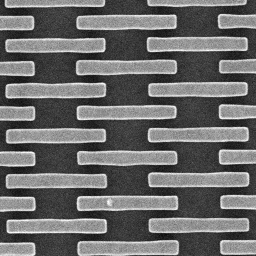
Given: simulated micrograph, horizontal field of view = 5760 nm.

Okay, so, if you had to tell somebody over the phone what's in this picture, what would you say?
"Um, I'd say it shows groups of lines, slits or small figures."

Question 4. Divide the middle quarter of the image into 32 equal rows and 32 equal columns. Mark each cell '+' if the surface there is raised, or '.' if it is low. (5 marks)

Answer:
...+++++++++++++++++++++++++....
...+++++++++++++++++++++++++....
...+++++++++++..................
................................
................................
++++++++++...........+++++++++++
++++++++++...........+++++++++++
++++++++++...........+++++++++++
................................
................................
....+++........++++++++++++.....
...+++++++++++++++++++++++++....
...+++++++++++++++++++++++++....
...+++++++++++++++++++++++......
................................
................................
++++++++++...........+++++++++++
++++++++++...........+++++++++++
++++++++++...........+++++++++++
+++++++.........................
................................
................................
...+++++++++++++++++++++++++....
...+++++++++++++++++++++++++....
....++++++++++++++++++++++++....
................................
................................
+....................+++++++++++
+++++++++++..........+++++++++++
+++++++++++..........+++++++++++
+++++++++++...........++++++++++
................................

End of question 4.